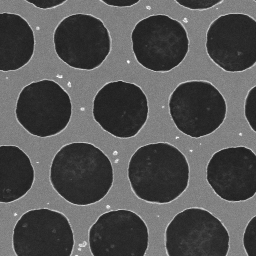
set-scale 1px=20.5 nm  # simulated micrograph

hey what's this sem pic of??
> holes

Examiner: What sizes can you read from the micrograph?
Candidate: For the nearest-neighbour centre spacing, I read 1550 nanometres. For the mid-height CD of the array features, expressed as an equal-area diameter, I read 1150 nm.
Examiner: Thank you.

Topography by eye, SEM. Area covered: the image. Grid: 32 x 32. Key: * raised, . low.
****....*****....******....*****
********************************
...*****....******....*****.....
....***......****......***......
....***.......**.......***......
....***.......***.......**......
....***.......***......***......
....****.....****......****.....
..*******...******....******...*
********************************
****...*******..*******...******
***.....****......****.....****.
**.......***......***.......***.
**.......***......***.......***.
**.......***......***.......***.
***.....****......****......***.
****...*******...******....*****
********************************
..******....******....******...*
...****......****......****.....
....**........**.......***......
....**........**........**......
....**........**........**......
....***.......***......****.....
...*****.....****.....*****.....
*********..*********************
***....*******..*******...******
**......****......****.....****.
**.......**.......***.......***.
**.......**........**........*..
**.......**.......***........*..
**.......**.......***.......***.